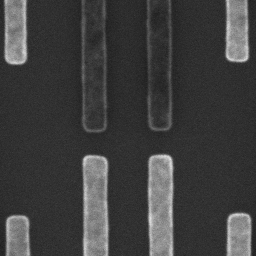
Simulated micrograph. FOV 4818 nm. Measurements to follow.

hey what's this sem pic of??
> wiring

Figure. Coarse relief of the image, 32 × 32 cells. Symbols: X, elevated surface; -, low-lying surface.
-XX-------XXX-----XXX-------XXX-
-XX-------XXX-----XXX-------XXX-
-XX-------XXX-----XXX-------XXX-
-XX-------XXX-----XXX-------XXX-
-XX-------XXX------XX-------XXX-
-XX-------XXX------XX-------XXX-
-XX-------XXX------XX-------XXX-
-XX-------XXX------XX--------XX-
----------XXX------XX-----------
----------XXX------XX-----------
----------XXX------XX-----------
----------XXX------XX-----------
----------XXX------XX-----------
----------XXX------XX-----------
----------XXX------XX-----------
----------XXX------XX-----------
--------------------------------
--------------------------------
--------------------------------
-------------------XX-----------
-----------XX------XX-----------
-----------XX------XX-----------
-----------XX------XX-----------
-----------XX------XX-----------
-----------XX------XX-----------
-----------XX------XX-----------
-----------XX------XX-----------
-XX--------XX------XX--------XX-
-XXX-------XX------XX--------XX-
-XXX-------XX------XX--------XX-
-XXX-------XX------XX-------XXX-
-XXX-------XX------XX-------XXX-